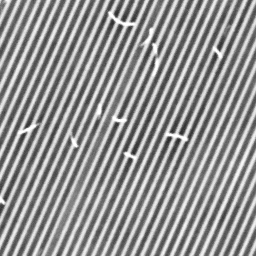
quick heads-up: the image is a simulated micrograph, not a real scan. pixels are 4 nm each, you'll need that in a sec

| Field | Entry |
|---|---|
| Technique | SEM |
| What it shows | parallel lines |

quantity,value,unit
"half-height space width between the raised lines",0.0211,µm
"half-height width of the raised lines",3.45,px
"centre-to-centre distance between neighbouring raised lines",36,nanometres